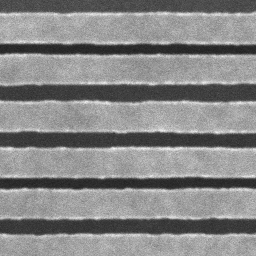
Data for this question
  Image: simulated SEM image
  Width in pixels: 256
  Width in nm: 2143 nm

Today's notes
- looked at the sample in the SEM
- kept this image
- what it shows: lines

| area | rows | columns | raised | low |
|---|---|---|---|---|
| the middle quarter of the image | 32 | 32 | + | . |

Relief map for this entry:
++++++++++++++++++++++++++++++++
++++++++++++++++++++++++++++++++
++++++++++++++++++++++++++++++++
++++++++++++++++++++++++++++++++
++++++++++++++++++++++++++++++++
................................
................................
................................
................................
..+++++++............++......++.
++++++++++++++++++++++++++++++++
++++++++++++++++++++++++++++++++
++++++++++++++++++++++++++++++++
++++++++++++++++++++++++++++++++
++++++++++++++++++++++++++++++++
++++++++++++++++++++++++++++++++
++++++++++++++++++++++++++++++++
................................
................................
................................
................................
++++++++++++++++++++++++++++++++
++++++++++++++++++++++++++++++++
++++++++++++++++++++++++++++++++
++++++++++++++++++++++++++++++++
++++++++++++++++++++++++++++++++
++++++++++++++++++++++++++++++++
++++++++++++++++++++++++++++++++
..++....+++.......+++...........
................................
................................
++++++++++++++++++++++++++++++++